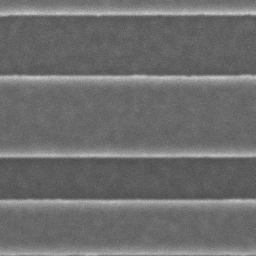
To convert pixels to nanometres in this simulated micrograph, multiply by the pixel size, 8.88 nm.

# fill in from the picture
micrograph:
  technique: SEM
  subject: lines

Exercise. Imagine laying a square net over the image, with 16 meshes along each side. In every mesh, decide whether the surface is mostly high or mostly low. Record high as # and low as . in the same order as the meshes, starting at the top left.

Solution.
################
................
................
................
................
################
################
################
################
################
................
................
..............#.
################
################
################